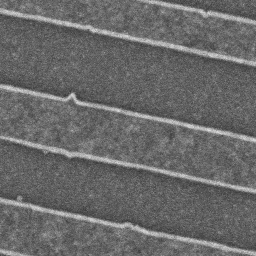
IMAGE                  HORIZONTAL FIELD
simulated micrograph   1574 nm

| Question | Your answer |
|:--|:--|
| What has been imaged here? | one or a few lines or trenches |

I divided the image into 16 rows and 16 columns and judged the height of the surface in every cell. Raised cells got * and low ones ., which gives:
************....
....************
.........*******
.............***
................
*...............
*****...........
**********......
***************.
....************
.........*******
..............**
................
*****...........
*********.......
**************..